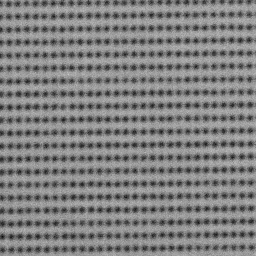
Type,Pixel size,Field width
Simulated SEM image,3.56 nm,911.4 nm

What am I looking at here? a regular array of holes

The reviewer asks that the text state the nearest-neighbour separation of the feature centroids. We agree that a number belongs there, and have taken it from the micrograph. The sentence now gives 31.4 nm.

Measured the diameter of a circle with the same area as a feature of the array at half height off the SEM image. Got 5.53 pixels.